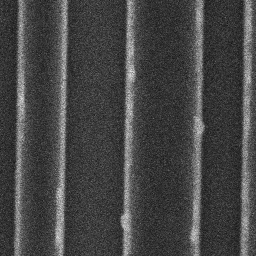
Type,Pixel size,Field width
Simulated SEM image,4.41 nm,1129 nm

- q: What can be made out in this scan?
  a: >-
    one or a few lines or trenches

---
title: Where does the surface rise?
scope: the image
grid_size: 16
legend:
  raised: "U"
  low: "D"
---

DUUUDDDDUUUUUDDU
DUUUDDDDUUUUUDDU
DUUUDDDDUUUUUDDU
DUUUDDDDUUUUUDDU
DUUUDDDDUUUUUDDU
DUUUDDDDUUUUUDDU
DUUUDDDDUUUUDDDU
DUUUDDDDUUUUUDDU
DUUUDDDDUUUUUDDU
DUUUDDDDUUUUDDDU
DUUUDDDDUUUUDDDU
DUUUDDDDUUUUDDDU
DUUUDDDDUUUUDDDU
DUUUDDDDUUUUDDDU
DUUUDDDDUUUUDDDU
DUUUDDDDUUUUDDDU